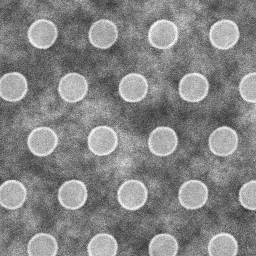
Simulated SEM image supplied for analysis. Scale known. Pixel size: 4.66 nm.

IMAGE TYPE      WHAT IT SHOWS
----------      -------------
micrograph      a regular array of raised bodies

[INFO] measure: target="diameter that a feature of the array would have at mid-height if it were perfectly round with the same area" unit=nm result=132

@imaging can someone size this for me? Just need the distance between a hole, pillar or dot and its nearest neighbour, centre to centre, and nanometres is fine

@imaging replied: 280